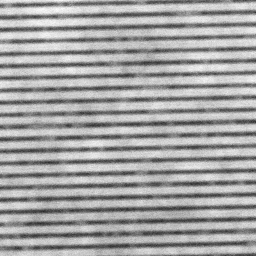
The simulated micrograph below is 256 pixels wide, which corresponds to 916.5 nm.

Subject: parallel lines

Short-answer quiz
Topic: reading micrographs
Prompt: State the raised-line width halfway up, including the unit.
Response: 17.4 nm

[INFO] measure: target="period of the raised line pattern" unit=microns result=0.0435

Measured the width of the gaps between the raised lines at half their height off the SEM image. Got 0.0264 um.